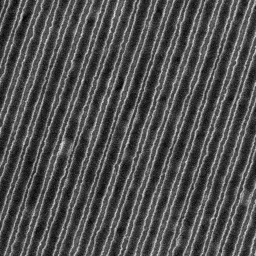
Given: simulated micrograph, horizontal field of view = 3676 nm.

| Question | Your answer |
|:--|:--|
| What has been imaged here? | parallel lines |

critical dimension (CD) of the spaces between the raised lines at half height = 64.9 nanometers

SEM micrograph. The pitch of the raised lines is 223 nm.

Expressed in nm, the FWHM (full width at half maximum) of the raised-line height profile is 162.